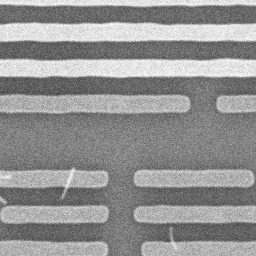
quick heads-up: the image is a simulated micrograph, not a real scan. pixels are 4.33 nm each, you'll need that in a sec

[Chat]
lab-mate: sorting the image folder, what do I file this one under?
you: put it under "groups of lines, slits or small figures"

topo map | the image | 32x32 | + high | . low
..+++++++++++++++++++++++++++.++
................................
................................
++++++++++++++++++++++++++++++++
++++++++++++++++++++++++++++++++
................................
................................
...........................+++..
++++++++++++++++++++++++++++++++
+++++++.+++.++++++++++....++++++
................................
................................
+++++++++++++++++++++++....+++++
++++++++++++++++++++++++...+++++
................................
................................
................................
................................
................................
................................
................................
+++++++++++++....++++++++++++++.
+++++++++++++....+++++++++++++++
................................
................................
................................
+++++++++++++....+++++++++++++++
+++++++++++++....+++++++++++++++
................................
................................
+++++++++++++.....++++++++++++++
+++++++++++++.....++++++++++++++